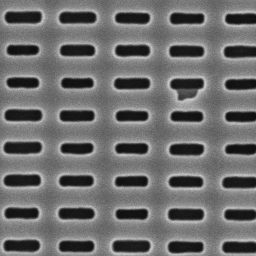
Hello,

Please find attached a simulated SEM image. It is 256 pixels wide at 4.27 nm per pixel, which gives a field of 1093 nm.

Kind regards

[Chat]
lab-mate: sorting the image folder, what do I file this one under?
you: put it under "a regular array of holes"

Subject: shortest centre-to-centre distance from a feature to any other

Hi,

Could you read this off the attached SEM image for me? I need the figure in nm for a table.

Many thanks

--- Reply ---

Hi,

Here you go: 139